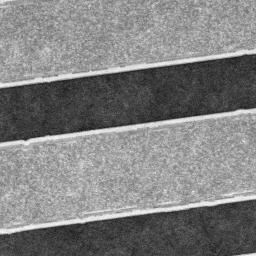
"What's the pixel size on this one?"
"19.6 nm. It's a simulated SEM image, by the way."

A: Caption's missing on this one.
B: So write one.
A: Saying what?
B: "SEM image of one or a few lines or trenches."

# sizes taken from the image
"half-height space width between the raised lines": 1180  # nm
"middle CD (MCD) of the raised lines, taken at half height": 84.7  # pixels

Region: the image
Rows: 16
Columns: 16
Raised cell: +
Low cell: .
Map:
++++++++++++++++
++++++++++++++++
++++++++++++++++
+++++++++++++...
++++++..........
................
................
............++++
.....+++++++++++
++++++++++++++++
++++++++++++++++
++++++++++++++++
++++++++++++++..
+++++++.........
................
................